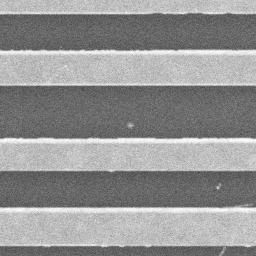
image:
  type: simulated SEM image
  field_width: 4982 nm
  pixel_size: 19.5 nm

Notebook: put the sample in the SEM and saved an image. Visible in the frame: lines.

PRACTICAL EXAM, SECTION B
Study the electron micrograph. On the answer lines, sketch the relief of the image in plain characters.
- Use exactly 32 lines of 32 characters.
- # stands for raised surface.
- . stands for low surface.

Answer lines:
################################
################################
................................
................................
................................
................................
................................
################################
################################
################################
################################
................................
................................
................................
................................
................................
................................
................................
################################
################################
################################
................................
................................
................................
................................
................................
################################
################################
################################
################################
################################
................................